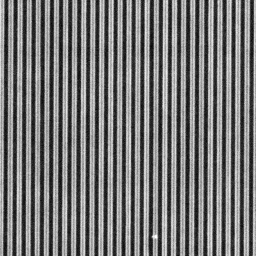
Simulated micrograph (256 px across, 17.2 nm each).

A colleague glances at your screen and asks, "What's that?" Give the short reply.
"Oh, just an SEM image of parallel lines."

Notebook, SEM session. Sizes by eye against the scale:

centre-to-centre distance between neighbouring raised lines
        157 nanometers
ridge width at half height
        0.0646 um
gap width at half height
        0.0818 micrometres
